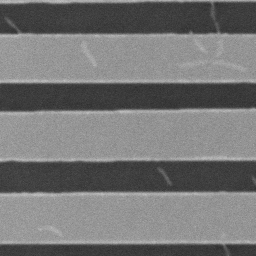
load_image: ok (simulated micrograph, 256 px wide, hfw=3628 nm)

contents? lines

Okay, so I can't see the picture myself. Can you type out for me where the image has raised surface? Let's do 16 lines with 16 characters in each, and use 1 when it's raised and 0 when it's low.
0000000000000000
0000000000000000
1111111111111111
1111111111111111
1111111111111111
0000000000000000
0000000000000000
1111111111111111
1111111111111111
1111111111111111
0000000000000000
0000000000000000
1111111111111111
1111111111111111
1111111111111111
0000000000000000